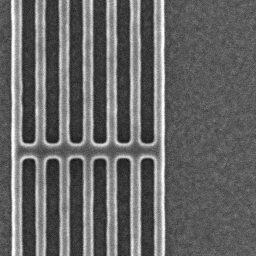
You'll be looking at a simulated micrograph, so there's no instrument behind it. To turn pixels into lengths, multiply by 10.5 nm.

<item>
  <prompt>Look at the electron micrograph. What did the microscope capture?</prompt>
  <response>groups of lines, slits or small figures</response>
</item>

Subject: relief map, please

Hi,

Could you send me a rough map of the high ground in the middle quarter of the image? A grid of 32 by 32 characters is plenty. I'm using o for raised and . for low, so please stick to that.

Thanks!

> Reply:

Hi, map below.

o....oo....oo....oo....oo.......
o....oo....oo....oo....oo.......
o....oo....oo....oo....oo.......
o....oo....oo....oo....oo.......
o....oo....oo....oo....oo.......
o....oo....oo....oo....oo.......
o....oo....oo....oo....oo.......
o....oo....oo....oo....oo.......
o....oo....oo....oo....oo.......
o....oo....oo....oo....oo.......
o....oo....oo....oo....oo.......
o....oo....oo....oo....oo.......
o....oo....oo....oo....oo.......
o....oo....oo....oo....oo.......
o....oo....oo....oo....oo.......
o....oo....oo....oo....oo.......
o....oo....oo....oo....oo.......
o....oo....oo....oo....oo.......
o....oo....oo....oo....oo.......
oo..ooo....oo...ooo...ooo.......
ooooooooooooooooooooooooo.......
ooooooooooooooooooooooooo.......
ooooooooooooooooooooooooo.......
oo..oooo..oooo..oooo..ooo.......
o....oo....oo....oo....oo.......
o....oo....oo....oo....oo.......
o....oo....oo....oo....oo.......
o....oo....oo....oo....oo.......
o....oo....oo....oo....oo.......
o....oo....oo....oo....oo.......
o....oo....oo....oo....oo.......
o....oo....oo....oo....oo.......